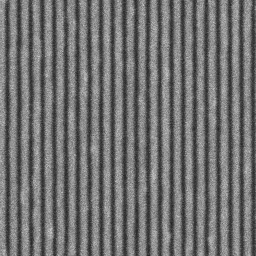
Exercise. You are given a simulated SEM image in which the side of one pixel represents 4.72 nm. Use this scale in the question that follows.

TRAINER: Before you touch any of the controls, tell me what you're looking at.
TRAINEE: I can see parallel lines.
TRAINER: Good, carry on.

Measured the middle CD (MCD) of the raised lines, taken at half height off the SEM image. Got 29.5 nanometers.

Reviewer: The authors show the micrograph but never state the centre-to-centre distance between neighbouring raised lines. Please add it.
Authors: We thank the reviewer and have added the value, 0.0552 um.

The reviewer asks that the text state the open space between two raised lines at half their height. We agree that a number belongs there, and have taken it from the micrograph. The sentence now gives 25.4 nm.